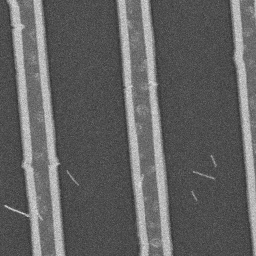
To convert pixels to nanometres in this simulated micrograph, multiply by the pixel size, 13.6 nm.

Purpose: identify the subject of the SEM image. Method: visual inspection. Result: one or a few lines or trenches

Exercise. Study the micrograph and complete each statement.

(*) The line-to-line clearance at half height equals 83.9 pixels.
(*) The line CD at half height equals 316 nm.